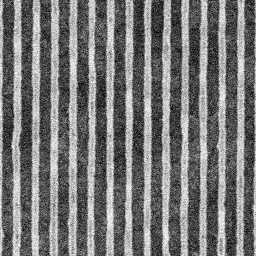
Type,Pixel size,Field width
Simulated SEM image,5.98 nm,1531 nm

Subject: parallel lines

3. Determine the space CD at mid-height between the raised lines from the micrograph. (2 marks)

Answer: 0.0725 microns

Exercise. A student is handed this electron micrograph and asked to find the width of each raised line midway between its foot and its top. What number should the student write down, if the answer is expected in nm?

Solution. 36.2